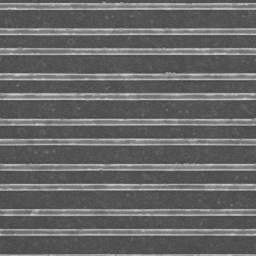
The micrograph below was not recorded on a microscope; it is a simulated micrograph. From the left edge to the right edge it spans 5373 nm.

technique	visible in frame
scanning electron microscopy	parallel lines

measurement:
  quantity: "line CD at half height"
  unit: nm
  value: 99.7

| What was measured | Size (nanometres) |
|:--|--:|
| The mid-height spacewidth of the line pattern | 415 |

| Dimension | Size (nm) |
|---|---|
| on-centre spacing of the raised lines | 475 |